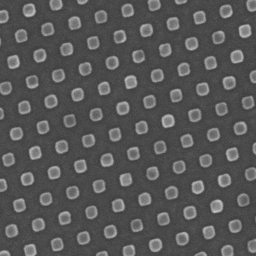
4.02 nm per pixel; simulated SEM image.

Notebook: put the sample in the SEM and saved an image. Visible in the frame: a regular array of raised bodies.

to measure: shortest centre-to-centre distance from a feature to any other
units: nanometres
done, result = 108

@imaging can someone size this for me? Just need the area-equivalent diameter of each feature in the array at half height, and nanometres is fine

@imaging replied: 49